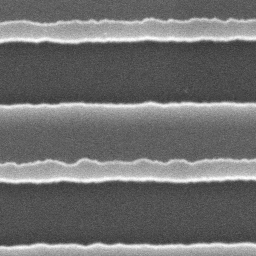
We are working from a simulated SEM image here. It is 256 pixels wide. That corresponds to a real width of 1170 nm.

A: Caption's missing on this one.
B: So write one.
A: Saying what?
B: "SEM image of lines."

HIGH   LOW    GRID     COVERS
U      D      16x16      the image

UUUUUUUUUUUUUUUU
UUUUUUUUUUUUUUUU
DDDUUDDDDDDDDDDD
DDDDDDDDDDDDDDDD
DDDDDDDDDDDDDDDD
DDDDDDDDDDDDDDDD
DDDDDDDDDDDDDDDD
UUUUUUUUUUUUUUUU
UUUUUUUUUUUUUUUU
UUUUUUUUUUUUUUUU
UUUUUUUUUUUUUUUU
DDDDDDDDDDDDDDDD
DDDDDDDDDDDDDDDD
DDDDDDDDDDDDDDDD
DDDDDDDDDDDDDDDD
DUUUUUUUUUUUUUUU